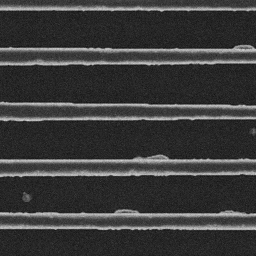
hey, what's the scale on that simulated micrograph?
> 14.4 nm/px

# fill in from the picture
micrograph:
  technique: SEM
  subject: lines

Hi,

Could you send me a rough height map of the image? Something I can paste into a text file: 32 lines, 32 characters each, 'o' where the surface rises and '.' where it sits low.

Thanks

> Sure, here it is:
oooooooooooooooooooooooooooooooo
................................
................................
................................
................................
................................
oooooooooooooooooooooooooooooooo
oooooooooooooooooooooooooooooooo
................................
................................
................................
................................
................................
oooooooooooooooooooooooooooooooo
oooooooooooooooooooooooooooooooo
................................
................................
................................
................................
................................
oooooooooooooooooooooooooooooooo
oooooooooooooooooooooooooooooooo
................................
................................
................................
................................
................................
oooooooooooooooooooooooooooooooo
oooooooooooooooooooooooooooooooo
................................
................................
................................